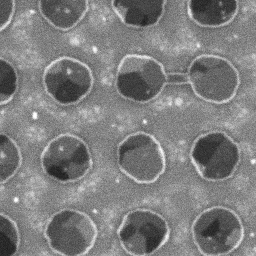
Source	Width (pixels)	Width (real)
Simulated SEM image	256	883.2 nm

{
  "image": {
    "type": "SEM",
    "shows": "raised bodies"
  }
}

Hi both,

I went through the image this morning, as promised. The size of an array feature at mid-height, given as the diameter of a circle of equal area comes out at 48.3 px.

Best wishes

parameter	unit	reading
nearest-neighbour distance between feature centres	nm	257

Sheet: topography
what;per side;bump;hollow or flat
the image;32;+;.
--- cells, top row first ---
++...++++++...+++++++...++++++..
++...++++++...++++++....++++++..
+.....++++.....+++++....+++++...
.......++.......................
................................
................................
................................
+......++......++++.....++++....
++....+++++....+++++....+++++...
++...+++++++...+++++++++++++++..
++....++++++..++++++++..++++++..
++....+++++....+++++....+++++...
+......+++......+++.......+++...
................................
................................
................................
...........................+....
++.....+++......+++......++++...
++....+++++....+++++....++++++..
+++..++++++....+++++....++++++..
+++..++++++....+++++....++++++..
++....+++++.....++++.....++++...
+......+++.......++.......++....
................................
................................
................................
.......+++......+++......++++...
+.....+++++....++++++...++++++..
++....++++++...++++++...++++++..
++....++++++...++++++...++++++..
++....++++++...+++++.....+++++..
++.....++++.....+++......++++...